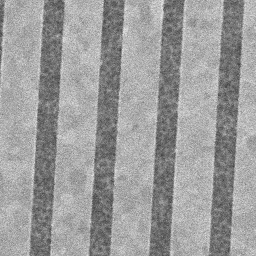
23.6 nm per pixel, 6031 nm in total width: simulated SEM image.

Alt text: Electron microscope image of parallel lines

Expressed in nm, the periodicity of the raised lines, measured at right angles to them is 1410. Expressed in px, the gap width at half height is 21.6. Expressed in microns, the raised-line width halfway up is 0.891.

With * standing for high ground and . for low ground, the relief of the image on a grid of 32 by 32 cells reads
.****...*****.*.****...*****...*
.****...*****...****...*****...*
.****...*****...****...*****..**
.****...*****..*****...*****..**
*****...*****..*****...*****..**
*****...*****..*****...*****..**
*****...*****..*****...****...**
*****...****...*****...****...**
*****...****...*****...****...**
*****...****...*****...****...**
*****...****...*****...****...**
*****..*****...*****...****...**
*****..*****...*****..*****...**
*****..*****...*****..*****...**
*****..*****...*****..*****...**
****...*****...****...*****...**
****...*****...****...*****...**
****...*****...****...*****...**
****...*****...****...*****...**
****...*****...****...*****..***
****...*****..*****...*****..***
****...*****..*****...*****..***
****...*****..*****...*****..***
****...*****..*****...*****..***
****...****...*****...****...***
****...****...*****...****...***
****...****...*****...****...***
****...****...*****...****...***
****..*****...*****...****...***
****..*****...*****..*****...***
****..******..*****..*****...***
****..*****...*****..*****...***